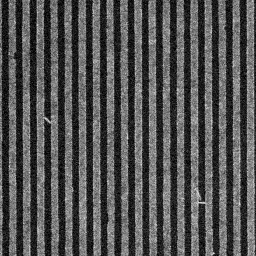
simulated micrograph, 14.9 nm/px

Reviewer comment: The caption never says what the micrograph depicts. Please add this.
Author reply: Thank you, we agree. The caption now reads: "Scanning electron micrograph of parallel lines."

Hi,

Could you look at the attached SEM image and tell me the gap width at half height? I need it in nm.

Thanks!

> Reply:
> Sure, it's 110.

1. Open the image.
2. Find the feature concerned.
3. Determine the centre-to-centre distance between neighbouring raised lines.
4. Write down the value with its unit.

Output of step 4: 208 nanometres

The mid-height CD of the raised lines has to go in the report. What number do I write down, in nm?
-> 96.7